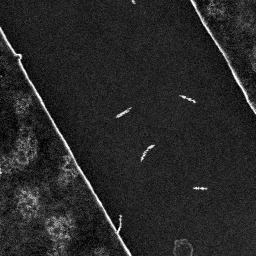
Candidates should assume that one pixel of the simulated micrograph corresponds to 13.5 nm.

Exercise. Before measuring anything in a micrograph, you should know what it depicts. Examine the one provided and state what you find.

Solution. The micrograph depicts one or a few lines or trenches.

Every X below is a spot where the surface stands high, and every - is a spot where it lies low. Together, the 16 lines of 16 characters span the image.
------------XXXX
-------------XXX
-------------XXX
X-------------XX
XX-------------X
XX-------------X
XXX-------------
XXX-------------
XXXX------------
XXXX------------
XXXXX-----------
XXXXXX----------
XXXXXX----------
XXXXXXX---------
XXXXXXX---------
XXXXXXXX--------